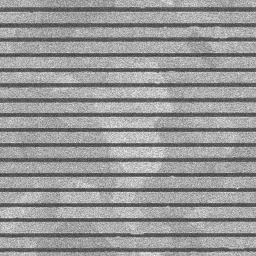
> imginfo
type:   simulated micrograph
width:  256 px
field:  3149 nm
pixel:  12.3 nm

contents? parallel lines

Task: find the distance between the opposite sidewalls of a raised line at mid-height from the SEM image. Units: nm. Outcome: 140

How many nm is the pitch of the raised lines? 185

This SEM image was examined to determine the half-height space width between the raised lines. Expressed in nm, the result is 47.7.